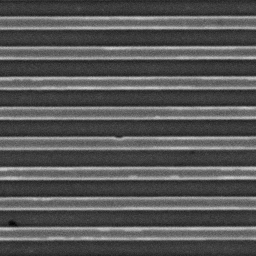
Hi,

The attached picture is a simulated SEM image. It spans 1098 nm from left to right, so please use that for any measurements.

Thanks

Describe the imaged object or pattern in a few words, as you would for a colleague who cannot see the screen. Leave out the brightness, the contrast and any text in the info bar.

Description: parallel lines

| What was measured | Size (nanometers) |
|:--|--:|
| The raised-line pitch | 129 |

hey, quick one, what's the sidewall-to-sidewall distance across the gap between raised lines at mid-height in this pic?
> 76.7 nm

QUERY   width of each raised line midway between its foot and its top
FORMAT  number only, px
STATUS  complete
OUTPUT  11.9